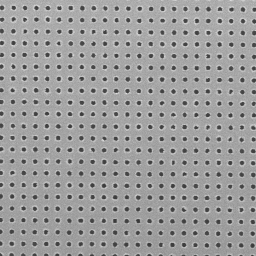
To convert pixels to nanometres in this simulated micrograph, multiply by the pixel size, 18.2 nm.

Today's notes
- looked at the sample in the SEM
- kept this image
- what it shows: a regular array of holes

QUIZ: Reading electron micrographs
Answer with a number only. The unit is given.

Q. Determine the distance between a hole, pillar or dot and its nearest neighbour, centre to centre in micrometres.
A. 0.205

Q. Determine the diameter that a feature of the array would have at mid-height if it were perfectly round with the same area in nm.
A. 84.5